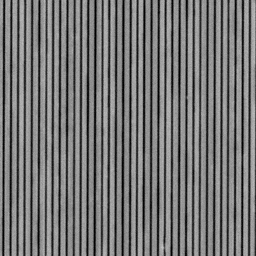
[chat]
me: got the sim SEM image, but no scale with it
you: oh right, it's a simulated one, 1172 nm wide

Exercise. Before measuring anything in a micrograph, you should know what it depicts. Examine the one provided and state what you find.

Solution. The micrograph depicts parallel lines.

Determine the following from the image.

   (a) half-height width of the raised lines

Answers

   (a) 24.6 nm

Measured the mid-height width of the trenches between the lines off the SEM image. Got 8.6 nm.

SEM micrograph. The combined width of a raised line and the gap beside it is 7.01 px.